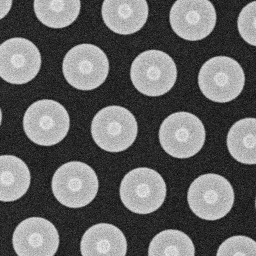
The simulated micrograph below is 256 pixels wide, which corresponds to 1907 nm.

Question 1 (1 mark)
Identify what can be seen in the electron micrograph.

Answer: an array of small figures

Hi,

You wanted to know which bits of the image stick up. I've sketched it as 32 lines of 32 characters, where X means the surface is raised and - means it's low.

X---XXXXXX---XXXXX----XXXX-----X
X---XXXXXX---XXXXX---XXXXXX---XX
-----XXXX----XXXXX---XXXXXX---XX
--------------XXXX----XXXXX---XX
----------------------XXXX----XX
XXXX---------------------------X
XXXXX----XXXX-----XX------------
XXXXX---XXXXX----XXXXX----XXX---
XXXXX---XXXXXX--XXXXXX---XXXXX--
XXXX----XXXXX---XXXXXX---XXXXXX-
---------XXXX----XXXXX---XXXXX--
------------------XXX----XXXXX--
-----X--------------------XXX---
----XXXX-----XX-----------------
---XXXXXX---XXXXX----XXX--------
---XXXXXX--XXXXXX---XXXXX----XXX
---XXXXX---XXXXXX---XXXXXX---XXX
----XXXX----XXXXX---XXXXXX--XXXX
-------------XXX----XXXXX---XXXX
XX--------------------XX-----XXX
XXX-----XXX---------------------
XXXX---XXXXX----XXXX------------
XXXX---XXXXX---XXXXX----XXXX----
XXX----XXXXX---XXXXXX---XXXXX---
XXX----XXXXX---XXXXXX--XXXXXX---
--------XXX-----XXXX----XXXXX---
-----------------XX-----XXXXX---
---XXX--------------------------
--XXXXX----XXXX-----------------
--XXXXX---XXXXXX---XXXX---------
--XXXXX---XXXXXX---XXXXX----XXXX
--XXXXX---XXXXXX---XXXXX---XXXXX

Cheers